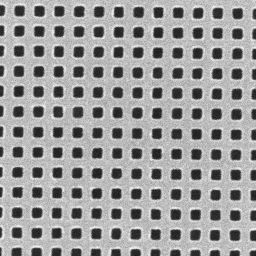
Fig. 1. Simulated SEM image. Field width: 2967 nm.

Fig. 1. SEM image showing a regular array of holes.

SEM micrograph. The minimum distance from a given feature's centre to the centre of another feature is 228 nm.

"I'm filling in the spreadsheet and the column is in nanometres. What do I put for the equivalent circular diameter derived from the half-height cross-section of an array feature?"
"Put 143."